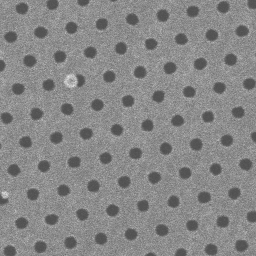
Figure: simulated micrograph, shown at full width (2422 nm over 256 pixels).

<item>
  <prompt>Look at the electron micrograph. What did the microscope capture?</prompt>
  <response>a regular array of holes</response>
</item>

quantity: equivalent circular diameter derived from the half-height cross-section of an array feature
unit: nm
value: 121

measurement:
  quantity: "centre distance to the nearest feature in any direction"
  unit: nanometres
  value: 286